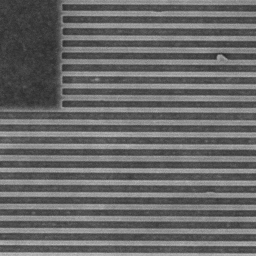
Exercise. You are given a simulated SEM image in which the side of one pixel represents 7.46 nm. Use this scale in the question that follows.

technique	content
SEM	parallel lines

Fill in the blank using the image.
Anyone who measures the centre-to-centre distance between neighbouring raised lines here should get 90.2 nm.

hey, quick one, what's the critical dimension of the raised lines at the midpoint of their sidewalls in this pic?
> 32.7 nm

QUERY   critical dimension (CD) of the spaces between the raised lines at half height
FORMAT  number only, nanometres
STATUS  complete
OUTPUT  58.8